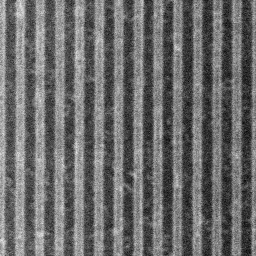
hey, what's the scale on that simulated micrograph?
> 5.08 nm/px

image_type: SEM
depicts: parallel lines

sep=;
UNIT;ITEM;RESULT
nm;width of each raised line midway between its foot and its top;73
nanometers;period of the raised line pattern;100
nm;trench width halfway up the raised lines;26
